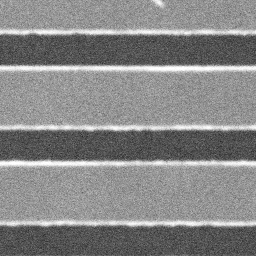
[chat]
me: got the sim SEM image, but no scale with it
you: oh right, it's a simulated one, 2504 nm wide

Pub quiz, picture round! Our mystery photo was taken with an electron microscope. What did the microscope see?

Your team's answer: lines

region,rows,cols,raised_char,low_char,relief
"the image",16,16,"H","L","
HHHHHHHHHHHHHHHH
HHHHHHHHHHHHHHHH
LLLLLLLLLLLLLLLL
LLLLLLLLLLLLLLLL
HHHHHHHHHHHHHHHH
HHHHHHHHHHHHHHHH
HHHHHHHHHHHHHHHH
HHHHHHHHHHHHHHHH
LLLLLLLLLLLLLLLL
LLLLLLLLLLLLLLLL
HHHHHHHHHHHHHHHH
HHHHHHHHHHHHHHHH
HHHHHHHHHHHHHHHH
HHHHHHHHHHHHHHHH
LLLLLLLLLLLLLLLL
LLLLLLLLLLLLLLLL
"